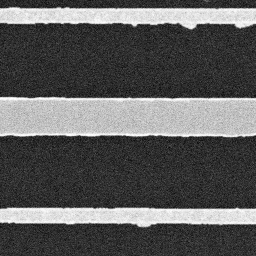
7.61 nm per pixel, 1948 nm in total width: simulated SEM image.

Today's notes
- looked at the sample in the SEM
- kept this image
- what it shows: lines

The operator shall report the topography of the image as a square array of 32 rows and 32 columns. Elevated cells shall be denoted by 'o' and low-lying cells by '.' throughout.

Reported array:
................................
oooooooooooooooooooooooooooooooo
oooooooooooooooooooooooooooooooo
................................
................................
................................
................................
................................
................................
................................
................................
................................
oooooooooooooooooooooooooooooooo
oooooooooooooooooooooooooooooooo
oooooooooooooooooooooooooooooooo
oooooooooooooooooooooooooooooooo
oooooooooooooooooooooooooooooooo
................................
................................
................................
................................
................................
................................
................................
................................
................................
oooooooooooooooooooooooooooooooo
oooooooooooooooooooooooooooooooo
................................
................................
................................
................................